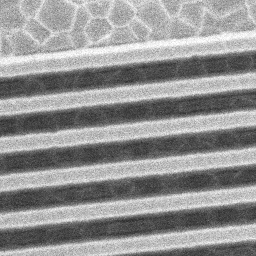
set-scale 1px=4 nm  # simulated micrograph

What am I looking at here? parallel lines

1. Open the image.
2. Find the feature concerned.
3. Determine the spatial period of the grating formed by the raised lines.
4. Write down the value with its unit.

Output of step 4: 151 nm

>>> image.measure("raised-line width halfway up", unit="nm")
72.5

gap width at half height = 19.2 pixels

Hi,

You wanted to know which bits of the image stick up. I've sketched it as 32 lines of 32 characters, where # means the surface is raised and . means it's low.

................................
................................
................................
................................
.............................###
....................############
..........#####################.
.#####################..........
#############...................
####......................######
.................###############
........####################....
###################.............
##########......................
##.....................#########
..............##################
.....#####################......
#################...............
########.......................#
.....................###########
............####################
...#####################........
###############.................
#####.......................####
...................#############
..........####################..
#####################...........
############....................
###......................#######
.................###############
.......#####################....
####################............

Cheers